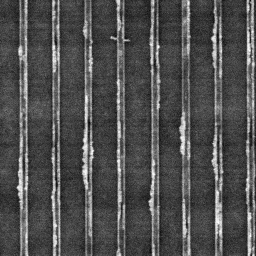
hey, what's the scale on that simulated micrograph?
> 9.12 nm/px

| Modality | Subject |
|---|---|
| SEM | parallel lines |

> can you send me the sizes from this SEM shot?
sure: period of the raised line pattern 32.5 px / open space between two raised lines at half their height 0.237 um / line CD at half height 0.0627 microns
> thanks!